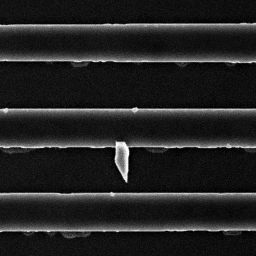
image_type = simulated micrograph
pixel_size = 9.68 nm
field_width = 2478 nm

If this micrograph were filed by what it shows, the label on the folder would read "lines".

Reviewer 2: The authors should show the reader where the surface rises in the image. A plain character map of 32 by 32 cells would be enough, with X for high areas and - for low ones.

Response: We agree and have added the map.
--------------------------------
--------------------------------
--------------------------------
XXXXXXXXXXXXXXXXXXXXXXXXXXXXXXXX
XXXXXXXXXXXXXXXXXXXXXXXXXXXXXXXX
XXXXXXXXXXXXXXXXXXXXXXXXXXXXXXXX
XXXXXXXXXXXXXXXXXXXXXXXXXXXXXXXX
XXXXXXXXXXXXXXXXXXXXXXXXXXXXXXXX
--------------------------------
--------------------------------
--------------------------------
--------------------------------
--------------------------------
--------------------------------
XXXXXXXXXXXXXXXXXXXXXXXXXXXXXXXX
XXXXXXXXXXXXXXXXXXXXXXXXXXXXXXXX
XXXXXXXXXXXXXXXXXXXXXXXXXXXXXXXX
XXXXXXXXXXXXXXXXXXXXXXXXXXXXXXXX
--------------XX----------------
--------------XX----------------
---------------X----------------
---------------X----------------
--------------------------------
--------------------------------
XXXXXXXXXXXXXXXXXXXXXXXXXXXXXXXX
XXXXXXXXXXXXXXXXXXXXXXXXXXXXXXXX
XXXXXXXXXXXXXXXXXXXXXXXXXXXXXXXX
XXXXXXXXXXXXXXXXXXXXXXXXXXXXXXXX
XXXXXXXXXXXXXXXXXXXXXXXXXXXXXXXX
--------------------------------
--------------------------------
--------------------------------